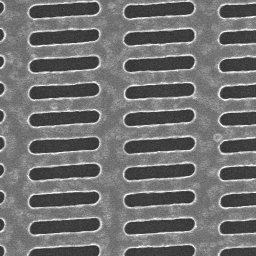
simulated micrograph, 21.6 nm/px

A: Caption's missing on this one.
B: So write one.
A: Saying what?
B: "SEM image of a regular array of holes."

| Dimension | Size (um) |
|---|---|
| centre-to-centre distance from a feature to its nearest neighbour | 0.582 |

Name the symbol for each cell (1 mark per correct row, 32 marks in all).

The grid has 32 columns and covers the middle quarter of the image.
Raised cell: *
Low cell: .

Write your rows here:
........*******.................
.....**********..............***
********************************
********************************
********************************
........**********..............
.........*******................
........*******.................
...*************....************
********************************
********************************
*****************************...
.........*******................
.........******.................
........*******................*
****************...*************
********************************
********************************
***.*...****************........
.........*******................
.........******.................
.......********................*
****************..**************
********************************
********************************
.........***********............
.........******.................
.........******.................
..*...*********.............****
********************************
********************************
********************************